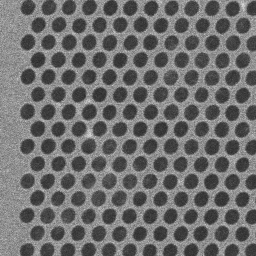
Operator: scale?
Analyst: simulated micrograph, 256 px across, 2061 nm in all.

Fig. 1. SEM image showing a regular array of holes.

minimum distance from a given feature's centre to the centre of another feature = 160 nanometers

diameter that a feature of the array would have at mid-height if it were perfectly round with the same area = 123 nm